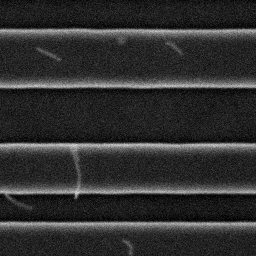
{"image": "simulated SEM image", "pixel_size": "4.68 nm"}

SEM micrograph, groups of lines, slits or small figures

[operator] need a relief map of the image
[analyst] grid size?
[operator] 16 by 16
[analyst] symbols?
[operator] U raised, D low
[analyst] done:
DDDDDDDDDDDDDDDD
DDDDDDDDDDDDDDDD
UUUUUUUUUUUUUUUU
UUUUUUUUUUUUUUUU
UUUUUUUUUUUUUUUU
DDDDDDDDDDDDDDDD
DDDDDDDDDDDDDDDD
DDDDDDDDDDDDDDDD
DDDDDDDDDDDDDDDD
UUUUUUUUUUUUUUUU
UUUUUUUUUUUUUUUU
UUUUUUUUUUUUUUUU
DDDDDDDDDDDDDDDD
DDDDDDDDDDDDDDDD
UUUUUUUUUUUUUUUU
UUUUUUUUUUUUUUUU